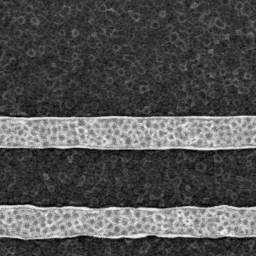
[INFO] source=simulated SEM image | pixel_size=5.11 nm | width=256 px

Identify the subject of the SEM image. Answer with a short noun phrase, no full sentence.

one or a few lines or trenches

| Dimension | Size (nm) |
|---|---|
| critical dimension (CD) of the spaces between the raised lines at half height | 306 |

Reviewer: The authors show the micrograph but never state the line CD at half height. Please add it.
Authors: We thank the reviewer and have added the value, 151 nm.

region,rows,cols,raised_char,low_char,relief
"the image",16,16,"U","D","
DDDDDDDDDDDDDDDD
DDDDDDDDDDDDDDDD
DDDDDDDDDDDDDDDD
DDDDDDDDDDDDDDDD
DDDDDDDDDDDDDDDD
DDDDDDDDDDDDDDDD
DDDDDDDDDDDDDDDD
UUUUUUUUUUUUUUUU
UUUUUUUUUUUUUUUU
DDDDDDDDDDDDDDDD
DDDDDDDDDDDDDDDD
DDDDDDDDDDDDDDDD
DDDDDDDDDDDDDDDD
UUUUUUUUUUUUUUUU
UUUUUUUUUUUUUUUU
DDDDDDDDDDDDDDDD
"